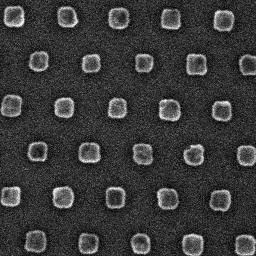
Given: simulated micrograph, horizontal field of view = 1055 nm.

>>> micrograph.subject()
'a regular array of raised bodies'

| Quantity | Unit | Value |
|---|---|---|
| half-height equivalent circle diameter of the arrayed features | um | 0.0832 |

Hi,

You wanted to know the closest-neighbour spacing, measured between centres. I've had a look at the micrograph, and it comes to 212 nm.